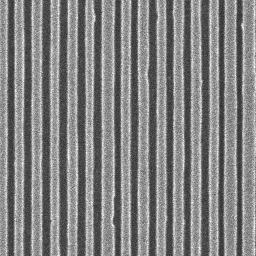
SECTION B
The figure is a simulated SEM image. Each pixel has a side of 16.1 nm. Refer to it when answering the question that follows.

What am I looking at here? parallel lines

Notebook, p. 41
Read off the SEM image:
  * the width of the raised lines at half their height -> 161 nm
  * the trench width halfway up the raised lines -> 7.56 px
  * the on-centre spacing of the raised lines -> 284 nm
